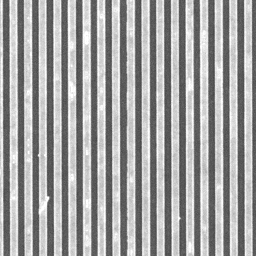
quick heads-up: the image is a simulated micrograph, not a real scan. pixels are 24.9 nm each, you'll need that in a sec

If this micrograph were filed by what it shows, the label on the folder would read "parallel lines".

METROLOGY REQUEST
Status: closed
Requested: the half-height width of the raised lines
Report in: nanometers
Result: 174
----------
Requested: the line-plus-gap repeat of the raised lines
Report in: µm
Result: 0.364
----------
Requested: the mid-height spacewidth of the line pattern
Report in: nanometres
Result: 196